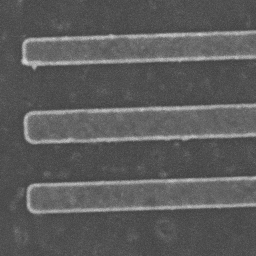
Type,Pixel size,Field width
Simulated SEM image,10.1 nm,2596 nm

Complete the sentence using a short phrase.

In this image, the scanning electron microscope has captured one or a few lines or trenches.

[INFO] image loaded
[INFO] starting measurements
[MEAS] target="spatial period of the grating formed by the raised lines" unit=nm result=745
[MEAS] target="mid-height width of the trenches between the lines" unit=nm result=464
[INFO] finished